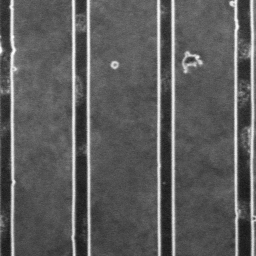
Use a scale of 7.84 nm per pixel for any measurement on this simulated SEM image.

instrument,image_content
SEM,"one or a few lines or trenches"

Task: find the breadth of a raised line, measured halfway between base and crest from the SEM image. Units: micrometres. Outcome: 0.123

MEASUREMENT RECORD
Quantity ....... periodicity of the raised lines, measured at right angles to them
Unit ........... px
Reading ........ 81.5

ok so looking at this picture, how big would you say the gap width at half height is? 0.49 micrometres